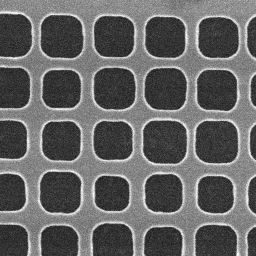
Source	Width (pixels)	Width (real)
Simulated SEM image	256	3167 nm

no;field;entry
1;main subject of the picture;a regular array of holes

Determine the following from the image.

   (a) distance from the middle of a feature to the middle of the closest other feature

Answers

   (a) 637 nanometres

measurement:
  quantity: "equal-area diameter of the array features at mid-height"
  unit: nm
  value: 542